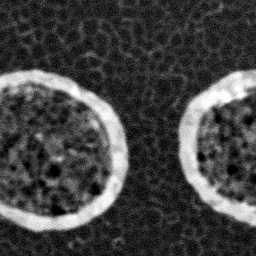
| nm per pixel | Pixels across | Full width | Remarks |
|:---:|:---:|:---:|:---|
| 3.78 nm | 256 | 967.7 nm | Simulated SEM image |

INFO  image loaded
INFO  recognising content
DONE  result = raised bodies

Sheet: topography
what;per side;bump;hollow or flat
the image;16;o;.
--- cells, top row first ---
................
................
................
................
................
oooo..........oo
oooooo.......ooo
ooooooo.....oooo
ooooooo.....oooo
ooooooo.....oooo
ooooooo.....oooo
ooooooo.....oooo
ooooooo......ooo
.oooo..........o
................
................